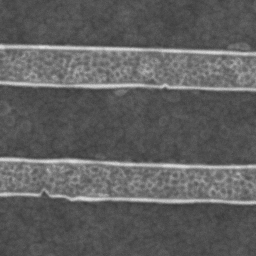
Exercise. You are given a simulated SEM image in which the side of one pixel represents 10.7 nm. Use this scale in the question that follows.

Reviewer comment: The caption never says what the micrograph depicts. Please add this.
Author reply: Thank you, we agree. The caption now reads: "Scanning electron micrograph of one or a few lines or trenches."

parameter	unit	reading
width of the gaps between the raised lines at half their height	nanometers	836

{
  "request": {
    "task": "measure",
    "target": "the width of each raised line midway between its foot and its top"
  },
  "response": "384 nm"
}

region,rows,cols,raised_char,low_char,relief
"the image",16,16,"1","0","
0000000000000000
0000000000000000
0000000000000000
1111111111111111
1111111111111111
0000000000000111
0000000000000000
0000000000000000
0000000000000000
0000000000000000
1111111111111111
1111111111111111
0000000001111111
0000000000000000
0000000000000000
0000000000000000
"